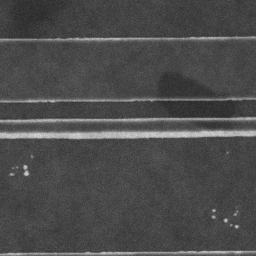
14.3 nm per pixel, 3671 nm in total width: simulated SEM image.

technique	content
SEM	lines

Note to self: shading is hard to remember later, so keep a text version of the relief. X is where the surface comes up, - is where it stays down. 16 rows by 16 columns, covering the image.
----------------
----------------
XXXXXXXXXXXXXXXX
XXXXXXXXXXXXXXXX
XXXXXXXXXXXXXXXX
XXXXXXXXXXXXXXXX
XXXXXXXXXXXXXXXX
XXXXXXXXXXXXXXXX
----------------
----------------
----------------
----------------
----------------
----------------
----------------
----------------